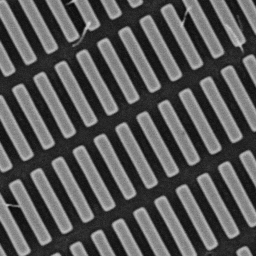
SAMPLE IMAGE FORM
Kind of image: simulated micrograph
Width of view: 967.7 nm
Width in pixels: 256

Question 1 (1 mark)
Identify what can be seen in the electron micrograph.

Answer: groups of lines, slits or small figures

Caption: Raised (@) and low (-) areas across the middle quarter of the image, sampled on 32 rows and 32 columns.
@---@@@@---@@@@---@@@@---@@@----
@----@@@----@@@---@@@@---@@@@---
@@---@@@@---@@@@---@@@----@@@---
@@@---@@@----@@@----@@@---@@@---
@@@---@@@@---@@@@---@@@@--------
@@@@---@@@@---@@@----@@@--------
-@@@----@@@---@@@@---@@-------@-
-@@@@---@@@@---@@@-----------@@@
--@@@----@@@----@@@----------@@@
--@@@@---@@@@---@@-------@----@@
---@@@----@@@-----------@@@---@@
---@@@@---@@@-----------@@@---@@
@---@@@@---@-------@@----@@@---@
@----@@@----------@@@@---@@@@---
@@---@@@-----------@@@----@@@---
@@----@-------@@---@@@@---@@@@--
@@@----------@@@@---@@@----@@@--
@@-----------@@@@---@@@@---@@@@-
--------@@@---@@@@---@@@----@@@-
--------@@@---@@@@---@@@@---@@@@
--------@@@@---@@@@---@@@@---@@@
--@@@----@@@----@@@---@@@@---@@@
--@@@@---@@@@---@@@@---@@@----@@
---@@@----@@@----@@@---@@@@---@@
----@@@---@@@@---@@@@---@@@@---@
@---@@@@---@@@----@@@----@@@----
@----@@@---@@@@---@@@@---@@@@---
@@---@@@@---@@@----@@@----@@----
@@----@@@---@@@@---@@@@---------
@@@---@@@@---@@@@---@@@---------
@@@@---@@@---@@@@---@@-------@@-
@@@@---@@@@---@@@@----------@@@-